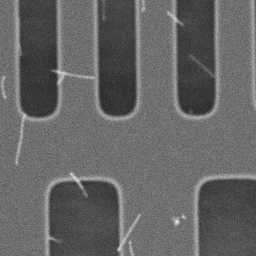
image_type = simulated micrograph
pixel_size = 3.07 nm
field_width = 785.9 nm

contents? groups of lines, slits or small figures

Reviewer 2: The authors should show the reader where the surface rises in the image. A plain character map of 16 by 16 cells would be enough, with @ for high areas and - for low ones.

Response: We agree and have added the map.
@---@@---@@--@@@
@---@@---@@--@@@
@---@@---@@--@@@
@---@@---@@--@@@
@---@@---@@--@@@
@---@@---@@--@@@
@---@@---@@--@@@
@@@@@@@@@@@@@@@@
@@@@@@@@@@@@@@@@
@@@@@@@@@@@@@@@@
@@@@@@@@@@@@@@@@
@@@@---@@@@@@---
@@@----@@@@@----
@@@----@@@@@----
@@@-----@@@@----
@@@----@@@@@----